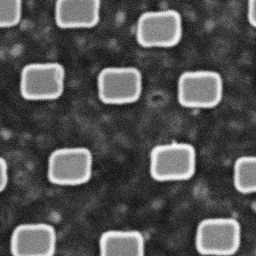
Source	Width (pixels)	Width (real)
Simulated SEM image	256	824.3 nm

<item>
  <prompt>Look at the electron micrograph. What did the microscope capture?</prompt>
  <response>raised bodies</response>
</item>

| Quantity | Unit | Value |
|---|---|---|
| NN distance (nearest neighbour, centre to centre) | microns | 0.249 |